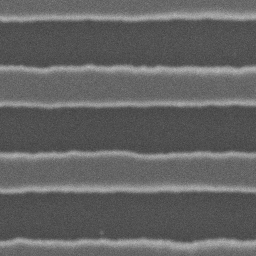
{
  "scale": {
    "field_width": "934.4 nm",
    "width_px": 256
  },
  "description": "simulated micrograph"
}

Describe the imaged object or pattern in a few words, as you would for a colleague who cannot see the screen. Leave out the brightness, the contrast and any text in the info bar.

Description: lines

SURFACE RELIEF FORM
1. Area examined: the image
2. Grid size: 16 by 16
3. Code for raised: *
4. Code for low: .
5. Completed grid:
****************
................
................
................
****************
****************
****************
................
................
....*.**........
****************
****************
................
................
................
****************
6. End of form